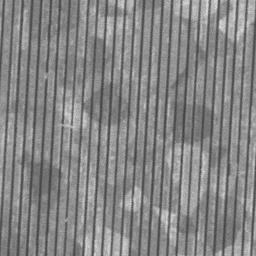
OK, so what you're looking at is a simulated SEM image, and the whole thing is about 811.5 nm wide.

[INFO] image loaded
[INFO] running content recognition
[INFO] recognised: parallel lines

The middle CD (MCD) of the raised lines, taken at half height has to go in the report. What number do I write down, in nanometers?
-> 19.8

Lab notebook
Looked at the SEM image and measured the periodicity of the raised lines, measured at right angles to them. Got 29.6 nanometres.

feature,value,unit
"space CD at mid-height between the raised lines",8.3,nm